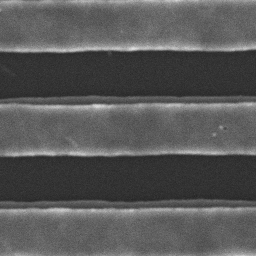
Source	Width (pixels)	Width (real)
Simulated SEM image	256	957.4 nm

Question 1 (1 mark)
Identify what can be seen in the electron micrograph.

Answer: lines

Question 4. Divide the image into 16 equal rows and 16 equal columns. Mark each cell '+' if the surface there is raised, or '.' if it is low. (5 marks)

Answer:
++++++++++++++++
++++++++++++++++
++++++++++++++++
................
................
................
++++++++++++++++
++++++++++++++++
++++++++++++++++
++++++++++++++++
................
................
............++..
++++++++++++++++
++++++++++++++++
++++++++++++++++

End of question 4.